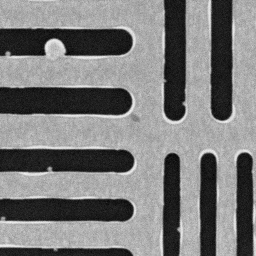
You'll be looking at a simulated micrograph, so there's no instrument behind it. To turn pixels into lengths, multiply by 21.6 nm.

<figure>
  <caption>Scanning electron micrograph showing groups of lines, slits or small figures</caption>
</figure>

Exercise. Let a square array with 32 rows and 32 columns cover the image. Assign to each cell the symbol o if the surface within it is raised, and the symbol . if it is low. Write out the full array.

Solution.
oooooooooooooooooooo...ooo...ooo
oooooooooooooooooooo...ooo...ooo
oooooooooooooooooooo...ooo...ooo
...........oo...oooo...ooo...ooo
.................ooo...ooo...ooo
......oo.........ooo...ooo...ooo
......oo........oooo...ooo...ooo
oooooooooooooooooooo...ooo...ooo
oooooooooooooooooooo...ooo...ooo
oooooooooooooooooooo...ooo...ooo
oooooooooooooooooooo...ooo...ooo
................oooo...ooo...ooo
.................ooo...ooo...ooo
.................ooo...ooo...ooo
oooooooo........ooooo..ooo...ooo
oooooooooooooooooooooooooooooooo
oooooooooooooooooooooooooooooooo
oooooooooooooooooooooooooooooooo
.............ooooooooooooooooooo
.................oooo.ooo..ooo..
.................ooo...oo..oo...
................oooo...oo..oo...
oooooooooooooooooooo...oo..oo...
oooooooooooooooooooo...oo..oo...
oooooooooooooooooooo...oo..oo...
.................ooo...oo..oo...
.................ooo...oo..oo...
................oooo...oo..oo...
oooooooooooooooooooo...oo..oo...
oooooooooooooooooooo...oo..oo...
oooooooooooooooooooo...oo..oo...
................oooo...oo..oo...